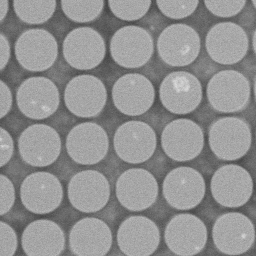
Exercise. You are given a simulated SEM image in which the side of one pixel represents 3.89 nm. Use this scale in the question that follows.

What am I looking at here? an array of small figures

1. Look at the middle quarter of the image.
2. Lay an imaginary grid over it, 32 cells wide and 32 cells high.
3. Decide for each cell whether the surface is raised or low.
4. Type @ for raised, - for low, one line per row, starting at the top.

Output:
--@@@@@@-------@@@@-------------
--------------------------------
---------------------------@@@@@
---@@@@@------@@@@@@-----@@@@@@@
-@@@@@@@@----@@@@@@@@----@@@@@@@
-@@@@@@@@@--@@@@@@@@@@--@@@@@@@@
@@@@@@@@@@--@@@@@@@@@@--@@@@@@@@
@@@@@@@@@@@-@@@@@@@@@@@-@@@@@@@@
@@@@@@@@@@--@@@@@@@@@@--@@@@@@@@
@@@@@@@@@@--@@@@@@@@@@---@@@@@@@
-@@@@@@@@@---@@@@@@@@@---@@@@@@@
-@@@@@@@@-----@@@@@@@-----@@@@@@
---@@@@@-------@@@@-------------
--------------------------------
----------------@@@--------@@@@@
---@@@@@@-----@@@@@@@-----@@@@@@
--@@@@@@@@---@@@@@@@@@---@@@@@@@
-@@@@@@@@@---@@@@@@@@@@--@@@@@@@
-@@@@@@@@@@--@@@@@@@@@@-@@@@@@@@
-@@@@@@@@@@--@@@@@@@@@@-@@@@@@@@
-@@@@@@@@@@--@@@@@@@@@@--@@@@@@@
-@@@@@@@@@@--@@@@@@@@@@--@@@@@@@
-@@@@@@@@@---@@@@@@@@@----@@@@@@
--@@@@@@@@----@@@@@@@------@@@@@
---@@@@@--------@@@@------------
--------------------------------
----------------@@@@-------@@@@@
---@@@@@@------@@@@@@@----@@@@@@
--@@@@@@@@----@@@@@@@@@--@@@@@@@
--@@@@@@@@@--@@@@@@@@@@--@@@@@@@
-@@@@@@@@@@--@@@@@@@@@@--@@@@@@@
-@@@@@@@@@@--@@@@@@@@@@--@@@@@@@